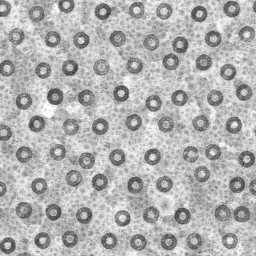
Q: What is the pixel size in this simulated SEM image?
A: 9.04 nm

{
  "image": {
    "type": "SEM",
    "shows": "a regular array of ring-shaped grooves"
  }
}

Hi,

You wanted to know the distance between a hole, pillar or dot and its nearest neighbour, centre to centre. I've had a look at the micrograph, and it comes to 27.3 pixels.